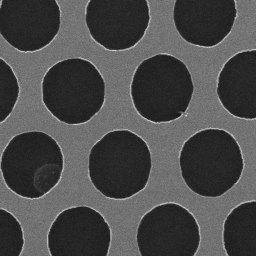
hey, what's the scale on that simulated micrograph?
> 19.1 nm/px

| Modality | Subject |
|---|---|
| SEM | holes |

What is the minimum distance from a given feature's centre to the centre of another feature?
1.66 µm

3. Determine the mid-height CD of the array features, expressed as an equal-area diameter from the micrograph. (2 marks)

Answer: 1240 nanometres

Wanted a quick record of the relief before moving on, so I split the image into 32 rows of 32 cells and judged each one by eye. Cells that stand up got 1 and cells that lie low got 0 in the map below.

00000001111000000011110000000111
00000001111000000001110000000111
00000000111000000001110000000111
00000001111000000011110000000111
00000001111000000011111000001111
10000011111110000111111100011111
11111111111111111111111111111100
11111111000111111100001111111000
01111100000011111000000111110000
00111100000001111000000011100000
00111000000001110000000011100000
00111000000001110000000011100000
00111000000001111000000011110000
00111100000001111000000111110000
01111110000011111100001111111000
11111111101111111111111111111111
11110111111111001111111110001111
10000001111110000011111100000111
10000001111100000001111000000011
00000000111000000001110000000011
00000000111000000001111000000011
00000000111000000001111000000011
10000001111000000011111000000011
10000001111100000011111100000111
11100111111110001111111110011111
11111111111111111111101111111100
01111111000011111110000011111000
00111110000001111100000011110000
00011100000000111000000001110000
00011100000000111000000001110000
00011100000000111000000001110000
00011100000001111000000011110000